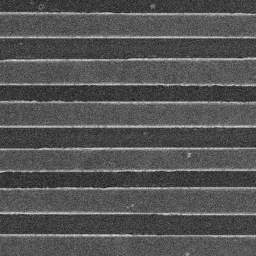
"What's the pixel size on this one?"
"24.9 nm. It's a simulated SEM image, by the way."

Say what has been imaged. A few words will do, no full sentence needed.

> lines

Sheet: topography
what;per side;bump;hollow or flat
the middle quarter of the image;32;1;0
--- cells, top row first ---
11111111111111111111111111111111
11111111111111111111111111111111
11111111111111111111111111111111
11111111111111111111111111111111
11111111111111111111111111111111
00000000000000000000000000000000
00000000000000000000000000000000
00000000000000000000000000000000
00000000000000000000000000000000
00000000000000000000000000000000
11111111111111111111111111111111
11111111111111111111111111111111
11111111111111111111111111111111
11111111111111111111111111111111
11111111111111111111111111111111
11111111111111111111111111111111
00000000000000000000000000000000
00000000000000000000000000000000
00000000000000000000000000000000
00000000000000000000000000000000
00000000000000000000000000000000
11111111111111111111111111111111
11111111111111111111111111111111
11111111111111111111111111111111
11111111111111111111111111111111
11111111111111111111111111111111
11111111111111111111111111111111
00000000000000000000000000000000
00000000000000000000000000000000
00000000000000000000000000000000
00000000000000000000000000000000
11111111111111111111111111111111